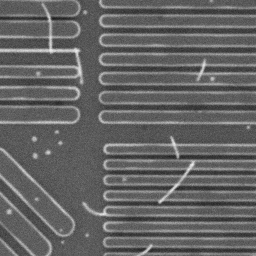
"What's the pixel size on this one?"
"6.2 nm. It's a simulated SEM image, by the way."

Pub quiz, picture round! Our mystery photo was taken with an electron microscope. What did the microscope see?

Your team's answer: groups of lines, slits or small figures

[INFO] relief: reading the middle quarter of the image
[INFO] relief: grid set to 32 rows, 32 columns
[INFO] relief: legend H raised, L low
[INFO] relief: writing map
LLLLLLLLLLLLLLLLLLLLLLLLLLLLLLLL
HHHHLLLLLLLLLLLLLLLLLLLLLLLLLLLL
HHHHLLLLLLHHHHHHHHHHHHHHHHHHHHHH
LLLLLLLLLHHHHHHHHHHHHHHHHHHHHHHH
LLLLLLLLLHHHHHHHHHHHHHHHHHHHHHHH
LLLLLLLLLLLLLLLLLLLLLLLLLLLLLLLL
HHHLLLLLLLLLLLLLLLLLLLLLLLLLLLLL
HHHHLLLLLHHHHHHHHHHHHHHHHHHHHHHH
HHHLLLLLLHHHHHHHHHHHHHHHHHHHHHHH
LLLLLLLLLHHHHHHHHHHHHHHHHHHHHHHH
LLLLLLLLLLLLLLLLLLLLLLLLLLLLLLLL
HHHLLLLLLLLLLLLLLLLLLLLLLLLLLLLL
HHHHLLLLLHHHHHHHHHHHHHHHHHHHHHHH
HHHHLLLLLHHHHHHHHHHHHHHHHHHHHHHH
HHHLLLLLLLHHHHHHHHHHHHHHHHHHHHHH
LLLLLLLLLLLLLLLLLLLLLLLLLLLLLLLL
LLLLLLLLLLLLLLLLLLLLLLLLLLLLLLLL
LLLLLLLLLLLLLLLLLLLLLLLLLLLLLLLL
LLLLLLLLLLLLLLLLLLLLLLLLLLLLLLLL
LLLLLLLLLLLLLLLLLLLLLLLLLLLLLLLL
LLLLLLLLLLLHHHHHHHHHHHHHHHHHHHHH
LLLLLLLLLLHHHHHHHHHHHHHHHHHHHHHH
LLLLLLLLLLLLLLLLLLLLLLLLLLLLHLLL
LLLLLLLLLLLLLLLLLLLLLLLLLLLLLLLL
LLLLLLLLLLHHHHHHHHHHHHHHHHHHHHHH
LLLLLLLLLLHHHHHHHHHHHHHHHHHHHHHH
LLLLLLLLLLLLLLLLLLLLLLLLLLLLLLLL
LLLLLLLLLLLLLLLLLLLLLLLLLLLLLLLL
LLLLLLLLLLHHHHHHHHHHHHHHHHHHHHHH
LLLLLLLLLLHHHHHHHHHHHHHHHHHHHHHH
LLLLLLLLLLLLLLLLLLLLLLLLLLLHLLLL
LLLLLLLLLLLLLLLLLLLLLLLLLLLHLLLL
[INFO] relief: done